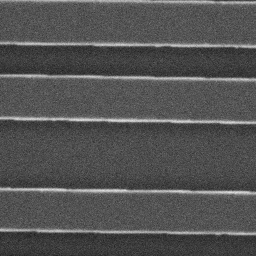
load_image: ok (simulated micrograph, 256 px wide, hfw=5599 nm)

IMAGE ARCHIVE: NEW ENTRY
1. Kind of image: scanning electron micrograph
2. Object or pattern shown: lines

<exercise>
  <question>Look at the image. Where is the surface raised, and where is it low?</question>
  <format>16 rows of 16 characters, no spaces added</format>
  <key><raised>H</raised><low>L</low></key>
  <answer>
HHHHHHHHHHHHHHHH
HHHHHHHHHHHHHHHH
HHHHHHHHHHHHHHHH
LLLLLLLLLLLLLLLL
LLLLLLLLLLLLLLLL
HHHHHHHHHHHHHHHH
HHHHHHHHHHHHHHHH
LLLLHHHHHHHHHHHH
LLLLLLLLLLLLLLLL
LLLLLLLLLLLLLLLL
LLLLLLLLLLLLLLLL
LLLLLLLLLLLLLLLL
HHHHHHHHHHHHHHHH
HHHHHHHHHHHHHHHH
LLLLLLHHHHHHHHHH
LLLLLLLLLLLLLLLL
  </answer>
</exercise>